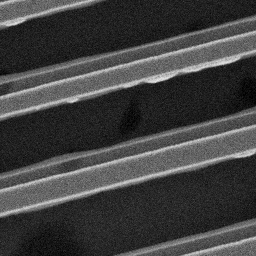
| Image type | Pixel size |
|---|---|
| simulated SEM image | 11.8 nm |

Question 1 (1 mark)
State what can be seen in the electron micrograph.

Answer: lines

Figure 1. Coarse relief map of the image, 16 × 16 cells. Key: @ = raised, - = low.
@@@@------------
@-------------@@
----------@@@@@@
------@@@@@@@@@-
--@@@@@@@@@@----
@@@@@@@@--------
@@@-------------
--------------@@
----------@@@@@@
------@@@@@@@@@@
--@@@@@@@@@@----
@@@@@@@@--------
@@@@------------
----------------
--------------@@
----------@@@@@@